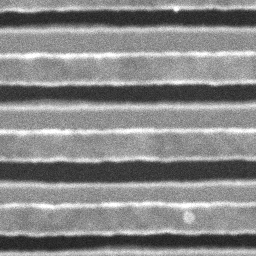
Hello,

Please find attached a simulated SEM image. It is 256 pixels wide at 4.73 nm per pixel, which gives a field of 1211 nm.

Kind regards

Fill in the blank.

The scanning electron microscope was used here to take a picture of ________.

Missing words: lines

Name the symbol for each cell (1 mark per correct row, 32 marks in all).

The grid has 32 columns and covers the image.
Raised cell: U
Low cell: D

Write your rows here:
UUUUUUUUUUUUUUUUUUUUUUUUUUUUUUUU
DDDUDDDDDDDDDDDDDDDDDDDDDDDDDDDD
DDDDDDDDDDDDDDDDDDDDDDDDDDDDDDDD
DDDDDDUUUUUUUUDDUDUUUUUUUUUUUDUD
UUUUUUUUUUUUUUUUUUUUUUUUUUUUUUUU
UUUUUUUUUUUUUUUUUUUUUUUUUUUUUUUU
UUUUUUUUUUUUUUUUUUUUUUUUUUUUUUUU
UUUUUUUUUUUUUUUUUUUUUUUUUUUUUUUU
UUUUUUUUUUUUUUUUUUUUUUUUUUUUUUUU
UUUUUUUUUUUUUUUUUUUUUUUUUUUUUUUU
DUUUUUUUUUUUUDUUUUDDDDDDDDUUDDDD
DDDDDDDDDDDDDDDDDDDDDDDDDDDDDDDD
DDDDDDDDDDDDDDDDDDDDDDDDDDDDDDDD
UUUUUUUUUUUUUUUUUUUUUUUUUUUUUUUU
UUUUUUUUUUUUUUUUUUUUUUUUUUUUUUUU
UUUUUUUUUUUUUUUUUUUUUUUUUUUUUUUU
UUUUUUUUUUUUUUUUUUUUUUUUUUUUUUUU
UUUUUUUUUUUUUUUUUUUUUUUUUUUUUUUU
UUUUUUUUUUUUUUUUUUUUUUUUUUUUUUUU
UUUUUUUUUUUUUUUUUUUUUUUUUUUUUUUU
DDDDDDDDDDDDDDDDDDDDDDDDDDDDDDDD
DDDDDDDDDDDDDDDDDDDDDDDDDDDDDDDD
DDDDDDDDDDDDDDDDDDDDDDDDDDDDDDDD
UUUUUUUUUUUUUUUUUUUUUUUUUUUUUUUU
UUUUUUUUUUUUUUUUUUUUUUUUUUUUUUUU
UUUUUUUUUUUUUUUUUUUUUUUUUUUUUUUU
UUUUUUUUUUUUUUUUUUUUUUUUUUUUUUUU
UUUUUUUUUUUUUUUUUUUUUUUUUUUUUUUU
UUUUUUUUUUUUUUUUUUUUUUUUUUUUUUUU
DDDDUDDDDDDDDDDDDDDDDDDDDDDDDDDD
DDDDDDDDDDDDDDDDDDDDDDDDDDDDDDDD
DUUUUUDUUUUUUUUUUUUUUUUUUUUUUUUU